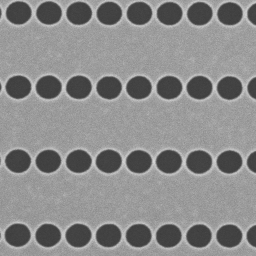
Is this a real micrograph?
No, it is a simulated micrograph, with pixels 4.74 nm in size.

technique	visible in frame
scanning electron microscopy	a regular array of holes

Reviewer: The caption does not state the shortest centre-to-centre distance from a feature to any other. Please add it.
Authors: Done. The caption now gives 30.1 px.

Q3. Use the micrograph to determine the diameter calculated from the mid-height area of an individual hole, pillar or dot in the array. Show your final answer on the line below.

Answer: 118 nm